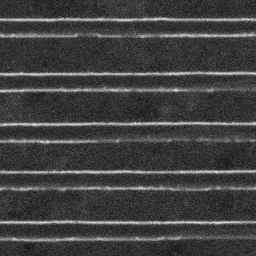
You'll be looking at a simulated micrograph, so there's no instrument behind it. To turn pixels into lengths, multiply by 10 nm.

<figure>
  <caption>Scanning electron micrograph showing lines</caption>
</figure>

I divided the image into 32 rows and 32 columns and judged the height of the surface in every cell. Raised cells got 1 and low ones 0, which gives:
00000000000000000000000000000000
00000000000000000000000000000000
11111111111111101111111111111111
11111111111111111111111111111111
11000000000000000110000000000000
00000000000000000000000000000000
00000000000000000000000000000000
00000000000000000000000000000000
00000000000000000000000000000000
11111111111111111111111111111111
11111111111111111111111111111111
00000000000000000000000000000000
00000000000000000000000000000000
00000000000000000000000000000000
00000000000000000000000000000000
01100110111111111111111111111111
11111111111111111111111111111111
11111111111111100000000000000000
00000000000000000000000000000000
00000000000000000000000000000000
00000000000000000000000000000000
00000000000000011000000001000111
11111111111111111111111111111111
11111001100001111011111111110110
00000000000000000000000000000000
00000000000000000000000000000000
00000000000000000000000000000000
00000000000000000000000000000000
11111111111111111111111111111111
11111111111111111111111111111111
00000000000000000000000000000000
00000000000000000000000000000000